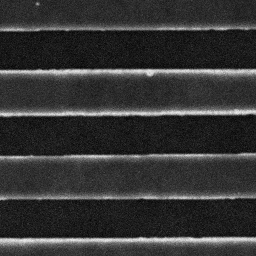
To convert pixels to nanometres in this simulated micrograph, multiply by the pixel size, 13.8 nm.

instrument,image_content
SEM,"lines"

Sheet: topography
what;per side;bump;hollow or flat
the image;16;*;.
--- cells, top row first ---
****************
****************
................
................
****************
****************
****************
................
................
................
****************
****************
................
................
................
****************